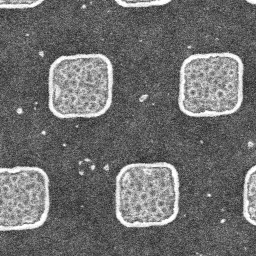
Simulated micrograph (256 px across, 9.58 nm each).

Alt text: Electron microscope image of raised bodies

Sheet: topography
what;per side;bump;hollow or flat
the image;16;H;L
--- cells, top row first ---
LLLLLLLLLLLLLLLL
LLLLLLLLLLLLLLLL
LLLLLLLLLLLLLLLL
LLLLLHLLLLLLHHLL
LLLHHHHLLLLHHHHL
LLLHHHHLLLLHHHHL
LLLHHHHLLLLHHHHL
LLLLLLLLLLLLLLLL
LLLLLLLLLLLLLLLL
LLLLLLLLLLLLLLLL
LLLLLLLLHHHLLLLL
HHHLLLLHHHHLLLLH
HHHLLLLHHHHLLLLH
HHHLLLLHHHHLLLLH
LLLLLLLLLLLLLLLL
LLLLLLLLLLLLLLLL